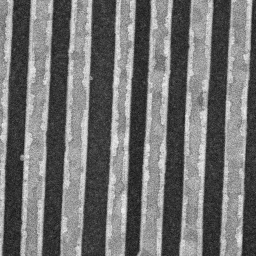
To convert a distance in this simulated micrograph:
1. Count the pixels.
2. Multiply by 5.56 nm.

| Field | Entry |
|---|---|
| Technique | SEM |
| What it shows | parallel lines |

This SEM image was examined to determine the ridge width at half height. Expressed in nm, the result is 106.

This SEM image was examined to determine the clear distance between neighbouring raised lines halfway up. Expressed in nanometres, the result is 116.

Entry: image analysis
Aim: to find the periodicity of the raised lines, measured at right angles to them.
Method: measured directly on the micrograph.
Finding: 221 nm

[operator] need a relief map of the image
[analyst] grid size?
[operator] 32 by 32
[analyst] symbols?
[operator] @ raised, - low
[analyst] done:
@---@@---@@----@@--@@---@@---@@-
@---@@---@@----@@--@@---@@---@@-
@---@@---@@----@@--@@---@@---@@-
@---@@---@@----@@--@@---@@---@@-
@---@@---@@----@@--@@---@@---@@-
@---@@---@@----@---@@---@@---@@-
@---@@---@@----@---@@---@@---@@-
@---@@---@@----@---@@---@@---@@-
@---@@---@@----@---@@---@@---@@-
@---@@---@@---@@---@@---@@---@@-
@---@@---@@---@@---@@---@@---@@-
@---@@---@@---@@---@@--@@@--@@@-
@---@@---@@---@@---@@--@@@--@@@-
@---@@---@@---@@--@@@--@@@--@@@-
@--@@@--@@@---@@--@@@--@@@--@@@-
@--@@@--@@@---@@--@@@--@@@--@@@-
@--@@@--@@@---@@--@@@--@@@--@@@-
@--@@@--@@@---@@--@@@--@@---@@@-
@--@@@--@@@---@@--@@@--@@---@@@-
@--@@@--@@@---@@--@@@--@@---@@--
---@@---@@@---@@--@@---@@---@@--
@--@@---@@@---@@--@@---@@---@@--
@--@@---@@@---@@--@@---@@---@@--
---@@---@@----@@--@@---@@---@@--
---@@---@@----@@--@@---@@---@@--
---@@---@@----@@--@@---@@---@@--
---@@---@@----@@--@@---@@---@@--
---@@---@@----@@--@@---@@---@@--
---@@---@@----@---@@---@@---@@--
---@@---@@----@---@@---@@---@@--
---@@---@@---@@---@@---@@---@@--
---@@---@@---@@--@@@---@@---@@--